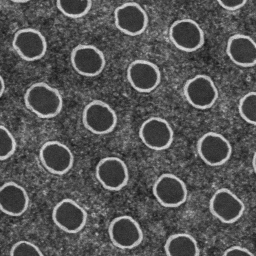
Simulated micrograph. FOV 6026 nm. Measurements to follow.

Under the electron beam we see a regular array of raised bodies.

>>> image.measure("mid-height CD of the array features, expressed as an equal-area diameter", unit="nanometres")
715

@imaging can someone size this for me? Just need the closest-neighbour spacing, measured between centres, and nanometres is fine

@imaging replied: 1360